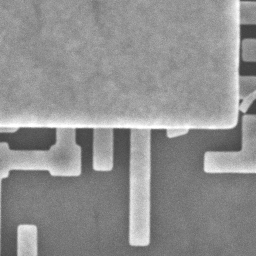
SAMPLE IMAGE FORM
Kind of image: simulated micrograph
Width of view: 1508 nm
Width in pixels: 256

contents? wiring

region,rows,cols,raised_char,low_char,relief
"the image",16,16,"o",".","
ooooooooooooooo.
ooooooooooooooo.
ooooooooooooooo.
ooooooooooooooo.
ooooooooooooooo.
ooooooooooooooo.
ooooooooooooooo.
ooooooooooooooo.
................
................
................
................
................
................
................
................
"